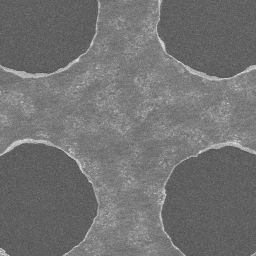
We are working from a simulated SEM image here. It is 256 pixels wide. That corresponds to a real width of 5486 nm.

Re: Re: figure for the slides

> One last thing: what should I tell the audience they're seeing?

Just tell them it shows holes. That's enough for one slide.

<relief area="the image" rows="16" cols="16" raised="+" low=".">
......++++......
......++++......
......++++......
.....++++++.....
+...++++++++...+
++++++++++++++++
++++++++++++++++
++++++++++++++++
++++++++++++++++
....+++++++++...
.....++++++.....
......++++......
......++++......
......++++......
.....+++++......
.....++++++.....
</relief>